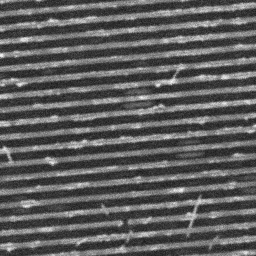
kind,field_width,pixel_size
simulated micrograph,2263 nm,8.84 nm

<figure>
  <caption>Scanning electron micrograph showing parallel lines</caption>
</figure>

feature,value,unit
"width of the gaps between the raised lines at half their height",0.0825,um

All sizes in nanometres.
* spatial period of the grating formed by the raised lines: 121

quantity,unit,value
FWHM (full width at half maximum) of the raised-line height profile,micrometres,0.0385